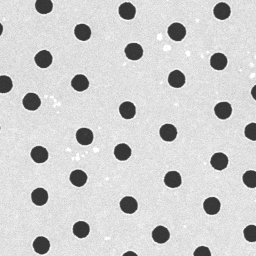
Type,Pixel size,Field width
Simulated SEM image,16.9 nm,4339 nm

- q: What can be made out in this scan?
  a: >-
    a regular array of holes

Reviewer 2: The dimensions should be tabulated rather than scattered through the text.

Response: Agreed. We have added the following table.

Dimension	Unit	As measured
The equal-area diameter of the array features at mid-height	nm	304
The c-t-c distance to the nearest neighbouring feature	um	0.736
